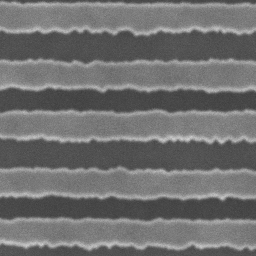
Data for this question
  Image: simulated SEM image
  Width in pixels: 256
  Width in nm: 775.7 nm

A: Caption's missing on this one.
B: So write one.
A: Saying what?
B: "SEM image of lines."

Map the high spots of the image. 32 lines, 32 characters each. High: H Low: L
HHHHHHHHHHHHHHHHHLHHHHHHLHHHLLHL
HHHHHHHHHHHHHHHHHHHHHHHHHHHHHHHH
HHHHHHHHHHHHHHHHHHHHHHHHHHHHHHHH
HHHHHHHHHHHHHHHHHHHHHHHHHHHHHHHH
LLLLLLLLLLLLLLLLLLLLLLLLLLLLLLLL
LLLLLLLLLLLLLLLLLLLLLLLLLLLLLLLL
LLLLLLLLLLLLLLLLLLLLLLLLLLLLLLLL
LLLLLLLLLLLLLLLLLLLLLLLLLLHLLLLL
HHHHHHHHHHHHHHHHHHHHHHHHHHHHHHHH
HHHHHHHHHHHHHHHHHHHHHHHHHHHHHHHH
HHHHHHHHHHHHHHHHHHHHHHHHHHHHHHHH
LLLLLLLLLLLLLLLLLLLLLLLLLLHLLLLL
LLLLLLLLLLLLLLLLLLLLLLLLLLLLLLLL
LLLLLLLLLLLLLLLLLLLLLLLLLLLLLLLL
HHHHHHHHHHHHHHHHHHHHHHHHHHHHHHHH
HHHHHHHHHHHHHHHHHHHHHHHHHHHHHHHH
HHHHHHHHHHHHHHHHHHHHHHHHHHHHHHHH
LLHHLLHHHHHHHHHLHHHLHHHHHHHHHHHH
LLLLLLLLLLLLLLLLLLLLLLLLLLLLLLLL
LLLLLLLLLLLLLLLLLLLLLLLLLLLLLLLL
LLLLLLLLLLLLLLLLLLLLLLLLLLLLLLLL
HHHHHHHHHHHHHHHHHHHHHHHHHHHHHHHH
HHHHHHHHHHHHHHHHHHHHHHHHHHHHHHHH
HHHHHHHHHHHHHHHHHHHHHHHHHHHHHHHH
HHHHHHLLHHHHHHHHHHHHHHHHHHHHHHHH
LLLLLLLLLLLLLLLLLLLLLLLLLLLLLLLL
LLLLLLLLLLLLLLLLLLLLLLLLLLLLLLLL
HHHHHHHHHLHHHHHHHLLHHHHLLLLLHLLL
HHHHHHHHHHHHHHHHHHHHHHHHHHHHHHHH
HHHHHHHHHHHHHHHHHHHHHHHHHHHHHHHH
HHHHHHHHHHHHHHHHHHHHHHHHHHHHHHHH
LLLLLLLLLLLLLLLLLLLLLLLLLLLLLLLL